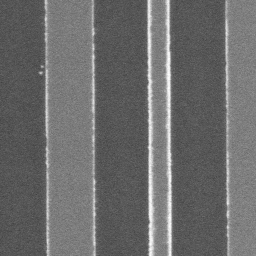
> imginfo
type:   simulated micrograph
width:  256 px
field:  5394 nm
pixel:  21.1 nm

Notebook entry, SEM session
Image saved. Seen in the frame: lines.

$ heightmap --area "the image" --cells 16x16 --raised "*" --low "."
...***...**...**
...***...**...**
...***...**...**
...***...**...**
...***...**...**
...***...**...**
...***...**...**
...***...**...**
...***...**...**
...***...**...**
...***...**...**
...***...**...**
...***...**...**
...***...**...**
...***...**...**
...***...**...**